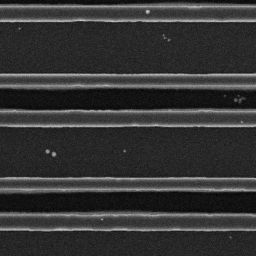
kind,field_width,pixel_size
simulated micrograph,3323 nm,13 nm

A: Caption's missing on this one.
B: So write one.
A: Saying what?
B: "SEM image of lines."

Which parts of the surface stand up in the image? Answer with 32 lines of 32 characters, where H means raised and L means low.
LLLLLLLLLLLLLLLLLLLLLLLLLLLLLLLL
HHHHHHHHHHHHHHHHHHHHHHHHHHHHHHHH
HHHHHHHHHHHHHHHHHHHHHHHHHHHHHHHH
LLLLLLLLLLLLLLLLLLLLLLLLLLLLLLLL
LLLLLLLLLLLLLLLLLLLLLLLLLLLLLLLL
LLLLLLLLLLLLLLLLLLLLLLLLLLLLLLLL
LLLLLLLLLLLLLLLLLLLLLLLLLLLLLLLL
LLLLLLLLLLLLLLLLLLLLLLLLLLLLLLLL
LLLLLLLLLLLLLLLLLLLLLLLLLLLLLLLL
HHHHHHHHHHHHHHHHHHHHHHHHHHHHHHHH
HHHHHHHHHHHHHHHHHHHHHHHHHHHHHHHH
LLLLLLLLLLLLLLLLLLLLLLLLLLLLLLLL
LLLLLLLLLLLLLLLLLLLLLLLLLLLLLLLL
LLLLLLLLLLLLLLLLLLLLLLLLLLLLLLLL
HHHHHHHHHHHHHHHHHHHHHHHHHHHHHHHH
HHHHHHHHHHHHHHHHHHHHHHHHHHHHHHHH
LLLLLLLLLLLLLLLLLLLLLLLLLLLLLLLL
LLLLLLLLLLLLLLLLLLLLLLLLLLLLLLLL
LLLLLLLLLLLLLLLLLLLLLLLLLLLLLLLL
LLLLLLLLLLLLLLLLLLLLLLLLLLLLLLLL
LLLLLLLLLLLLLLLLLLLLLLLLLLLLLLLL
LLLLLLLLLLLLLLLLLLLLLLLLLLLLLLLL
HHHHHHHHHHHHHHHHHHHHHHHHHHHHHHHH
HHHHHHHHHHHHHHHHHHHHHHHHHHHHHHHH
LLLLLLLLLLLLLLLLLLLLLLLLLLLLLLLL
LLLLLLLLLLLLLLLLLLLLLLLLLLLLLLLL
LLLLLLLLLLLLLLLLLLLLLLLLLLLLLLLL
HHHHHHHHHHHHHHHHHHHHHHHHHHHHHHHH
HHHHHHHHHHHHHHHHHHHHHHHHHHHHHHHH
LLLLLLLLLLLLLLLLLLLLLLLLLLLLLLLL
LLLLLLLLLLLLLLLLLLLLLLLLLLLLLLLL
LLLLLLLLLLLLLLLLLLLLLLLLLLLLLLLL